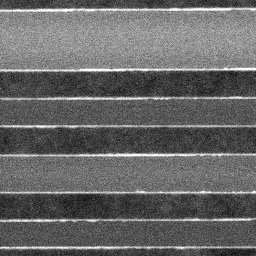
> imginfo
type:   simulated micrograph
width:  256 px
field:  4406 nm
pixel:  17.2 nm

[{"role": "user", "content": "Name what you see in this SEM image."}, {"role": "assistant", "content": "lines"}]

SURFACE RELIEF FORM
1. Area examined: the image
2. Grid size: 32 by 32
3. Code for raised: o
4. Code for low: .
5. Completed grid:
oooooooooooooooooooooooooooooooo
................................
................................
................................
................................
................................
................................
................................
................................
oooooooooooooooooooooooooooooooo
oooooooooooooooooooooooooooooooo
oooooooooooooooooooooooooooooooo
................................
................................
................................
................................
oooooooooooooooooooooooooooooooo
oooooooooooooooooooooooooooooooo
oooooooooooooooooooooooooooooooo
................................
................................
................................
................................
................................
oooooooooooooooooooooooooooooooo
oooooooooooooooooooooooooooooooo
oooooooooooooooooooooooooooooooo
oooooooooooooooooooooooooooooooo
................................
................................
................................
oooooooooooooooooooooooooooooooo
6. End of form